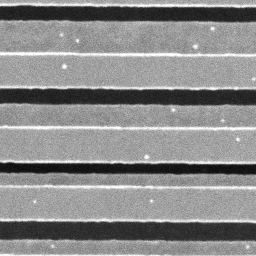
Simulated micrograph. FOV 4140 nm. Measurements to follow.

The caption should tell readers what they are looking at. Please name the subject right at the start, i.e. lines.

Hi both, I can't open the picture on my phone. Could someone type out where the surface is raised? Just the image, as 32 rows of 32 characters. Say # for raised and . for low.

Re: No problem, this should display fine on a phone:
################################
................................
................................
################################
################################
################################
################################
################################
################################
################################
################################
................................
................................
################################
################################
################################
################################
################################
################################
################################
................................
................................
################################
################################
################################
################################
################################
################################
................................
................................
################################
################################